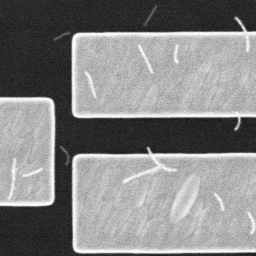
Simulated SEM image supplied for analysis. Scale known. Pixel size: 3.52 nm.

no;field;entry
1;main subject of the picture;wiring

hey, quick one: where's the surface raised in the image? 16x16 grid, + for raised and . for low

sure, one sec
................
................
.....+++++++++++
.....+++++++++++
.....+++++++++++
.....+++++++++++
+++..+++++++++++
+++.............
+++.............
+++.............
+++..+++++++++++
+++..+++++++++++
+++..+++++++++++
.....+++++++++++
.....+++++++++++
.....+++++++++++